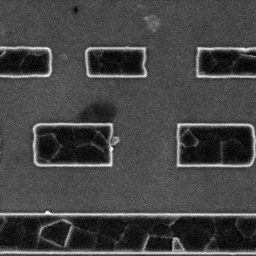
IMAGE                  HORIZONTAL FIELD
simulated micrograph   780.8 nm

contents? one or a few lines or trenches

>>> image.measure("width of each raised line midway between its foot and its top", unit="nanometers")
119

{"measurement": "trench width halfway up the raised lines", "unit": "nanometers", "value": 147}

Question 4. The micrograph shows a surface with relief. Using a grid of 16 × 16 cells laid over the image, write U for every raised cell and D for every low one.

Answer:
DDDDDDDDDDDDDDDD
DDDDDDDDDDDDDDDD
DDDDDDDDDDDDDDDD
UUUDDUUUUDDDUUUU
UUUDDDUUUDDDUUUU
DDDDDDDDDDDDDDDD
DDDDDDDDDDDDDDDD
DDDDDDDDDDDDDDDD
DDUUUUUDDDDUUUUU
DDUUUUUDDDDUUUUU
DDDDDDDDDDDDDDDD
DDDDDDDDDDDDDDDD
DDDDDDDDDDDDDDDD
UUUUUUUUUUUUUUUU
UUUUUUUUUUUUUUUU
UUUUUUUUUUUUUUUU